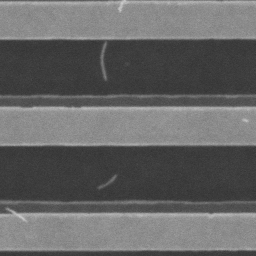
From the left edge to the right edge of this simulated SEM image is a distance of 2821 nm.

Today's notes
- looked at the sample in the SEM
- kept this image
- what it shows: lines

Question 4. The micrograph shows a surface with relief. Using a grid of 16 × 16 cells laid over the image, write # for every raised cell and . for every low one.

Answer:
################
################
................
................
................
................
################
################
################
................
................
................
................
################
################
################